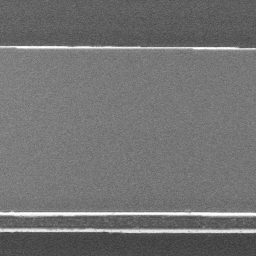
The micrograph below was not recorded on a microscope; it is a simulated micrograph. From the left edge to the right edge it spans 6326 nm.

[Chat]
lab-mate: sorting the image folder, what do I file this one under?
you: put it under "lines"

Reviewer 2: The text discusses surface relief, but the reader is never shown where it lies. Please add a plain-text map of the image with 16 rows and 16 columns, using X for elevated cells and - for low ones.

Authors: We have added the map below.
----------------
----------------
----------------
XXXXXXXXXXXXXXXX
XXXXXXXXXXXXXXXX
XXXXXXXXXXXXXXXX
XXXXXXXXXXXXXXXX
XXXXXXXXXXXXXXXX
XXXXXXXXXXXXXXXX
XXXXXXXXXXXXXXXX
XXXXXXXXXXXXXXXX
XXXXXXXXXXXXXXXX
XXXXXXXXXXXXXXXX
XXXXXXXXXXXXXXXX
-------------X--
----------------